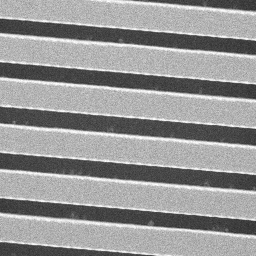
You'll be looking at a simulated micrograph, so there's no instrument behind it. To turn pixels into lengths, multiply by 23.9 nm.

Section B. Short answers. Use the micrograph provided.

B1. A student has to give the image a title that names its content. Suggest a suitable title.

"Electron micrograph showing lines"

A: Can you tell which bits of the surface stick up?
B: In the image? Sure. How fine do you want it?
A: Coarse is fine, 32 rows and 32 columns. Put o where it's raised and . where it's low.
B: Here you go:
ooooooooooooooooooooo...........
oooooooooooooooooooooooooooooooo
...ooooooooooooooooooooooooooooo
...............ooooooooooooooooo
oooo......................oooooo
ooooooooooooooo.................
ooooooooooooooooooooooooooo.....
oooooooooooooooooooooooooooooooo
.........ooooooooooooooooooooooo
....................oooooooooooo
ooooooooo......................o
oooooooooooooooooooo............
oooooooooooooooooooooooooooooooo
...ooooooooooooooooooooooooooooo
..............oooooooooooooooooo
.........................ooooooo
oooooooooooo....................
ooooooooooooooooooooooo.........
oooooooooooooooooooooooooooooooo
.....ooooooooooooooooooooooooooo
................oooooooooooooooo
oooo........................oooo
ooooooooooooooo.................
oooooooooooooooooooooooooooo....
oooooooooooooooooooooooooooooooo
.........ooooooooooooooooooooooo
....................oooooooooooo
oooooooooo.....................o
oooooooooooooooooooooo..........
oooooooooooooooooooooooooooooooo
...ooooooooooooooooooooooooooooo
...............ooooooooooooooooo